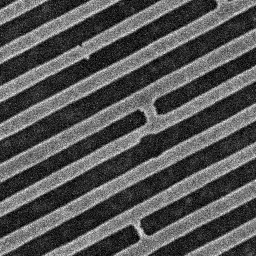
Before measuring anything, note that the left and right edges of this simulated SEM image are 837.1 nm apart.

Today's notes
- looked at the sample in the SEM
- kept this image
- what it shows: parallel lines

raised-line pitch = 111 nanometres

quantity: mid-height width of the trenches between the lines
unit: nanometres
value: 66.4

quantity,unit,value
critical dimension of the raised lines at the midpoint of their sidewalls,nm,46.2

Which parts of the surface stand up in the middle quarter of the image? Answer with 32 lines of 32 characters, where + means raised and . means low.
+...........+++++++............+
..........+++++++...........++++
........+++++++............+++++
......+++++++............+++++++
....++++++++...........++++++++.
..++++++++...........++++++++...
++++++++............+++++++.....
++++++............+++++++.......
++++............++++++++........
++............++++++++.........+
............++++++++++........++
..........++++++++.++++.....++++
........++++++++....+++...++++++
......++++++++.......++++++++++.
....++++++++.........+++++++....
...+++++++..........++++++......
.++++++++.........+++++++.......
+++++++.........+++++...........
+++++.........+++++.............
+++.........+++++++...........++
+.........+++++++...........++++
........+++++++...........++++++
.......++++++............+++++++
.....++++++............+++++++..
...+++++++...........+++++++....
.+++++++...........+++++++......
++++++...........+++++++........
++++...........+++++++..........
++............++++++...........+
............++++++...........+++
.........+++++++...........+++++
.......+++++++............++++++